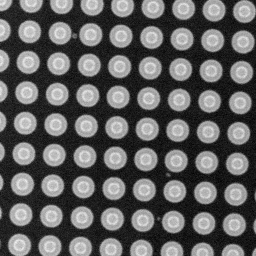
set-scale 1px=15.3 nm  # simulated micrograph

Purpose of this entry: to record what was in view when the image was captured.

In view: an array of small figures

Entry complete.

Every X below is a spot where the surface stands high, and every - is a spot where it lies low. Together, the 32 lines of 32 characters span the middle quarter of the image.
X---XXXXX--XXXXXX--XXXXX---XXXXX
X---XXXXX--XXXXXX--XXXXX--XXXXXX
-----XXX----XXXX---XXXXX---XXXXX
--------------------XXX----XXXX-
--------------------------------
-----XX-------------------------
X---XXXX---XXXXX---XXXX-----XX--
X--XXXXXX--XXXXX---XXXXX---XXXX-
X--XXXXXX--XXXXX---XXXXX--XXXXX-
----XXXX---XXXXX---XXXXX--XXXXX-
-----XX-----XXX----XXXX----XXXX-
----------------------------XX--
--------------------------------
----XXX-----XX------------------
X--XXXXX---XXXXX---XXXX----XXX--
X--XXXXX---XXXXX--XXXXX---XXXXX-
---XXXXX---XXXXX--XXXXXX--XXXXX-
----XXXX---XXXX---XXXXX---XXXXX-
------------XX-----XXXX---XXXX--
--------------------------------
----X---------------------------
---XXXX----XXXX----XXX----------
---XXXXX--XXXXX---XXXXX---XXXX--
---XXXXX--XXXXXX--XXXXX--XXXXXX-
---XXXXX--XXXXX---XXXXX--XXXXXX-
----XXX----XXXX---XXXXX---XXXX--
--------------------X-----XXXX--
--------------------------------
---XXX------X-------------------
--XXXXX---XXXXX---XXXX----XXX---
--XXXXX---XXXXX--XXXXXX--XXXXX--
--XXXXX---XXXXX--XXXXXX--XXXXX--